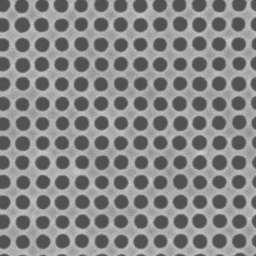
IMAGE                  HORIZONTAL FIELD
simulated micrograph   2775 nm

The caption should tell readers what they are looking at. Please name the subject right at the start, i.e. a regular array of holes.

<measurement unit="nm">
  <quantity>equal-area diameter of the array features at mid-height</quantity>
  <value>158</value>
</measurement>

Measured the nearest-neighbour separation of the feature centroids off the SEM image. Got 209 nm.